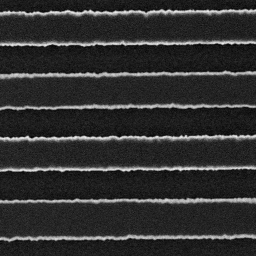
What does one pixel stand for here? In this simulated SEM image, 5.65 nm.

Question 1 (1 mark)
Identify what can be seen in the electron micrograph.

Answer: lines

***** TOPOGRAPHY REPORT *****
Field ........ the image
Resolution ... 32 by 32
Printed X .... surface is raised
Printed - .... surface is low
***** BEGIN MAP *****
--------------------------------
XXX-X-XXX-XXXXXXXXXXXXXXXXXXXXXX
XXXXXXXXXXXXXXXXXXXXXXXXXXXXXXXX
XXXXXXXXXXXXXXXXXXXXXXXXXXXXXXXX
XXXXXXXXXXXXXXXXXXXXXXXXXXXXXXXX
XXXXXXXXXXXXXXXXXXXXXXX---------
--------------------------------
--------------------------------
--------------------------------
XXXXXXXXXXXXXXXXXXXXXXXXXXXXXXXX
XXXXXXXXXXXXXXXXXXXXXXXXXXXXXXXX
XXXXXXXXXXXXXXXXXXXXXXXXXXXXXXXX
XXXXXXXXXXXXXXXXXXXXXXXXXXXXXXXX
XXXXXXXXXXX-XXXX----------------
--------------------------------
--------------------------------
--------------------------------
XXXXXXXXXXXXXXXXXXXXXXXXXXXXXXXX
XXXXXXXXXXXXXXXXXXXXXXXXXXXXXXXX
XXXXXXXXXXXXXXXXXXXXXXXXXXXXXXXX
XXXXXXXXXXXXXXXXXXXXXXXXXXXXXXXX
--------------------------------
--------------------------------
--------------------------------
--------------------------------
XXXXXXXXXXXXXXXXXXXXXXXXXXXXXXXX
XXXXXXXXXXXXXXXXXXXXXXXXXXXXXXXX
XXXXXXXXXXXXXXXXXXXXXXXXXXXXXXXX
XXXXXXXXXXXXXXXXXXXXXXXXXXXXXXXX
XXXXXXXXXXXXXXXXXXXXXXXXXXXXXXXX
--------------------------------
--------------------------------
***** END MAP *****